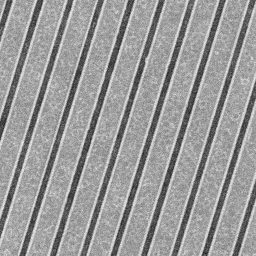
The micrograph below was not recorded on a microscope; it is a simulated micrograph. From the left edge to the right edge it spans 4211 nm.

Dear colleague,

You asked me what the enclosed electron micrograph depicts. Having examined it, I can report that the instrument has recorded parallel lines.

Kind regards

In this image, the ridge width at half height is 358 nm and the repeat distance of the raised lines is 477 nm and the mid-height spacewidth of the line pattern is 7.76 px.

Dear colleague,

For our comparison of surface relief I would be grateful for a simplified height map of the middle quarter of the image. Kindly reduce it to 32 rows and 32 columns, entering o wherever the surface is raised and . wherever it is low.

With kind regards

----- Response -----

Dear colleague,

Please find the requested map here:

ooo..oooooo..ooooo...ooooo..oooo
ooo..ooooo...ooooo..oooooo..oooo
ooo..ooooo..oooooo..ooooo..ooooo
oo..oooooo..ooooo..oooooo..ooooo
oo..oooooo..ooooo..oooooo..ooooo
oo..ooooo..oooooo..ooooo...ooooo
o..oooooo..ooooo...ooooo..oooooo
o..oooooo..ooooo..oooooo..ooooo.
o..ooooo..oooooo..oooooo..ooooo.
...ooooo..ooooo...ooooo..oooooo.
..oooooo..ooooo..oooooo..ooooo..
..ooooo..oooooo..oooooo..ooooo..
..ooooo..oooooo..ooooo..oooooo..
.oooooo..ooooo...ooooo..oooooo..
.ooooo...ooooo..oooooo..ooooo..o
.ooooo..oooooo..ooooo..oooooo..o
oooooo..ooooo...ooooo..oooooo..o
oooooo..ooooo..oooooo..ooooo..oo
ooooo..oooooo..ooooo...ooooo..oo
ooooo..ooooo...ooooo..oooooo..oo
ooooo..ooooo..oooooo..ooooo..ooo
oooo..oooooo..oooooo..ooooo..ooo
oooo..ooooo...ooooo..oooooo..ooo
oooo..ooooo..oooooo..ooooo...ooo
ooo..oooooo..oooooo..ooooo..oooo
ooo..oooooo..ooooo..oooooo..oooo
ooo..ooooo...ooooo..oooooo..oooo
oo...ooooo..oooooo..ooooo..ooooo
oo..oooooo..ooooo..oooooo..ooooo
oo..ooooo...ooooo..oooooo..ooooo
oo..ooooo..oooooo..ooooo..oooooo
o..oooooo..ooooo...ooooo..ooooo.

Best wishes